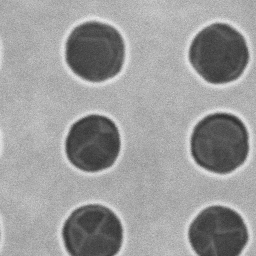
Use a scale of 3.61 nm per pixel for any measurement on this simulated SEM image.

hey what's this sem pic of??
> holes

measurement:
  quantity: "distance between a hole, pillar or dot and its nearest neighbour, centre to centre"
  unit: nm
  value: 327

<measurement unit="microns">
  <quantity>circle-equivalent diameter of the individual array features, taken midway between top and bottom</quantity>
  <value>0.219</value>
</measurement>